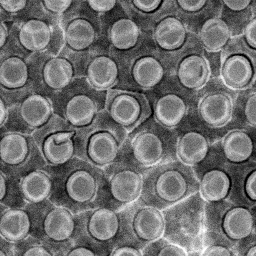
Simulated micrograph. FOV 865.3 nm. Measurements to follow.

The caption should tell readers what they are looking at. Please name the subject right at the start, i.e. a regular array of raised bodies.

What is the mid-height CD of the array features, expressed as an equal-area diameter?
98.9 nm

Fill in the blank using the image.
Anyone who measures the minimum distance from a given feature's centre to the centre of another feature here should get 148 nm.